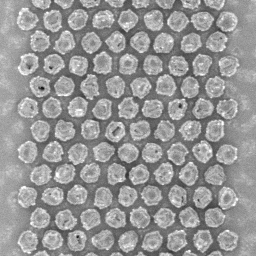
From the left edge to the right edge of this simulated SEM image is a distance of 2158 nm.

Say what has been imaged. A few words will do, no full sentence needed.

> a regular array of raised bodies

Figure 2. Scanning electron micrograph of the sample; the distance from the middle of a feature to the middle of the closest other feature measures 0.202 microns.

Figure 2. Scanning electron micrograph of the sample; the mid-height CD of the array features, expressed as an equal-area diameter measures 0.159 µm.